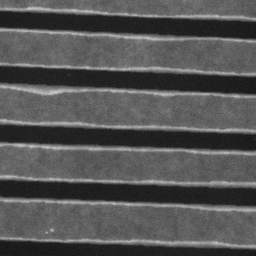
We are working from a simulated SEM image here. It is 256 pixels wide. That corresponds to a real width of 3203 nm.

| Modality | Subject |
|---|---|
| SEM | lines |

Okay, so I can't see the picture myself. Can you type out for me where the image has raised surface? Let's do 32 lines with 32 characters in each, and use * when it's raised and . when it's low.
********************************
........************************
..............................**
................................
******************..............
********************************
********************************
********************************
..........**********************
................................
................................
*********************...........
********************************
********************************
********************************
..******************************
...............................*
................................
**************..................
********************************
********************************
********************************
....****************************
................................
................................
********************............
********************************
********************************
********************************
********************************
...................*************
................................